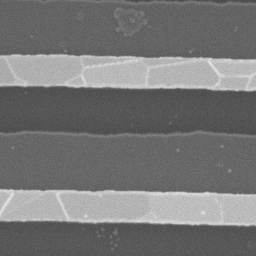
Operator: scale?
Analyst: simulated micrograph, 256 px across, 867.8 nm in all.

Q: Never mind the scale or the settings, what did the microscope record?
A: lines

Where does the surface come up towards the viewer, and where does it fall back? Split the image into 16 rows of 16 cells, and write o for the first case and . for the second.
oooooooooooooooo
oooooooooooooooo
oooooooooooooooo
oooooooooooooooo
oooooooooooooooo
.............ooo
................
................
oooooo.ooooooooo
oooooooooooooooo
oooooooooooooooo
oooooooooooooooo
oooooooooooooooo
oooooooooooooooo
................
................